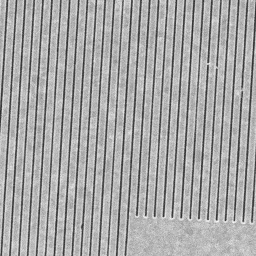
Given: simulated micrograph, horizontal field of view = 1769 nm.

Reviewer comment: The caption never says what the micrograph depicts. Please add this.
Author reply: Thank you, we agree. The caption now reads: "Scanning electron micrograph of parallel lines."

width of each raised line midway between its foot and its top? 44.9 nanometers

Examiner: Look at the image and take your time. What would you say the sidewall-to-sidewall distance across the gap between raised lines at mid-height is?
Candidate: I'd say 12.9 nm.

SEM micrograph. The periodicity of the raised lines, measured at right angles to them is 61.4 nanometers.